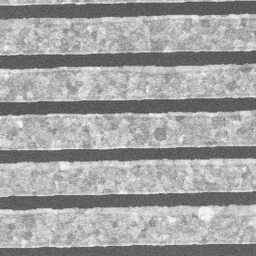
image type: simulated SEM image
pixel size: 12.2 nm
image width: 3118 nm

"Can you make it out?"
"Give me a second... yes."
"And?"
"lines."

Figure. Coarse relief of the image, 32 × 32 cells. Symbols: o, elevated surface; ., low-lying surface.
oooo............................
................................
............oooooooooooooooooooo
oooooooooooooooooooooooooooooooo
oooooooooooooooooooooooooooooooo
oooooooooooooooooooooooooooooooo
oooooooooooooooo................
................................
..........................oooooo
oooooooooooooooooooooooooooooooo
oooooooooooooooooooooooooooooooo
oooooooooooooooooooooooooooooooo
oooooooooo......................
................................
......oooooooooooooooooooooooooo
oooooooooooooooooooooooooooooooo
oooooooooooooooooooooooooooooooo
oooooooooooooooooooooooooooooooo
oooooooooooooo..................
................................
................oooooooooooooooo
oooooooooooooooooooooooooooooooo
oooooooooooooooooooooooooooooooo
oooooooooooooooooooooooooooooooo
o...............................
................................
oo.ooooooooooooooooooooooooooooo
oooooooooooooooooooooooooooooooo
oooooooooooooooooooooooooooooooo
oooooooooooooooooooooooooooooooo
oooooooooooooooooooooooooo......
................................